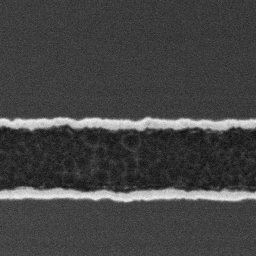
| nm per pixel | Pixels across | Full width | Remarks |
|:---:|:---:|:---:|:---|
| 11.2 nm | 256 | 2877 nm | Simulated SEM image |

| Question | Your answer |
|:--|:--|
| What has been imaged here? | one or a few lines or trenches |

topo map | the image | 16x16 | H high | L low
HHHHHHHHHHHHHHHH
HHHHHHHHHHHHHHHH
HHHHHHHHHHHHHHHH
HHHHHHHHHHHHHHHH
HHHHHHHHHHHHHHHH
HHHHHHHHHHHHHHHH
HHHHHHHHHHHHHHHH
HHHHHHHHHHHHHHHH
LLLLLLLLLLLLLLLL
LLLLLLLLLLLLLLLL
LLLLLLLLLLLLLLLL
LLLLLLLLLLLLLLLL
HHHHHHHHHHHHHHHH
HHHHHHHHHHHHHHHH
HHHHHHHHHHHHHHHH
HHHHHHHHHHHHHHHH